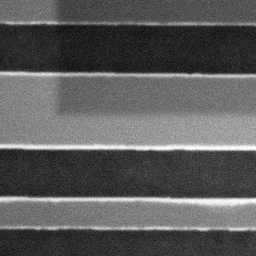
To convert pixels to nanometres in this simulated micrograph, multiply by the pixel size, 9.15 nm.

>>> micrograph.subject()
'lines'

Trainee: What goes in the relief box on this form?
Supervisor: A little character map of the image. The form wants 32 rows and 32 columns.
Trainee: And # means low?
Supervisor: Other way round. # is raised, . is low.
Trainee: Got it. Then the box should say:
################################
################################
################################
................................
................................
................................
................................
................................
................................
################################
################################
################################
################################
################################
################################
################################
################################
################################
....############################
................................
................................
................................
................................
................................
................................
################################
################################
################################
....####...#####################
................................
................................
................................